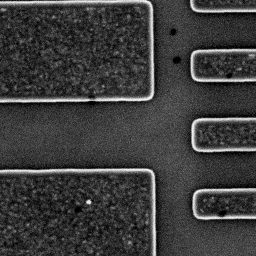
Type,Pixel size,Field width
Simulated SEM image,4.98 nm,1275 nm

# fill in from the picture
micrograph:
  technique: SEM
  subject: wiring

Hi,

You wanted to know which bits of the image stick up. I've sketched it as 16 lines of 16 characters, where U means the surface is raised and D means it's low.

UUUUUUUUUDDDUUUU
UUUUUUUUUUDDDDDD
UUUUUUUUUUDDDDDD
UUUUUUUUUUDDUUUU
UUUUUUUUUUDDUUUU
UUUUUUUUUUDDDDDD
DDDDDDDDDDDDDDDD
DDDDDDDDDDDDUUUU
DDDDDDDDDDDDUUUU
DDDDDDDDDDDDDDDD
DDDDDDDDDDDDDDDD
UUUUUUUUUUDDDDDD
UUUUUUUUUUDDUUUU
UUUUUUUUUUDDUUUU
UUUUUUUUUUDDDDDD
UUUUUUUUUUDDDDDD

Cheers